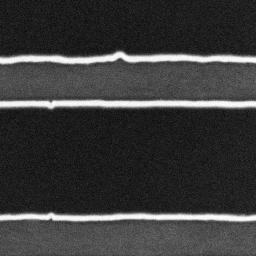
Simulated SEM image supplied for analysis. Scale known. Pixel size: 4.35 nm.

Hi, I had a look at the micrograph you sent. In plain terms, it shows one or a few lines or trenches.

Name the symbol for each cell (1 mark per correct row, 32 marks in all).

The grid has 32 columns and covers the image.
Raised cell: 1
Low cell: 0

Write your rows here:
11111111111111111111111111111111
11111111111111111111111111111111
11111111111111111111111111111111
11111111111111111111111111111111
11111111111111111111111111111111
11111111111111111111111111111111
11111111111111111111111111111111
11100001111110001000000011100111
00000000000000000000000000000000
00000000000000000000000000000000
00000000000000000000000000000000
00000000000000000000000000000000
00000000000000000000000000000000
11111111111111111111111111111111
11111111111111111111111111111111
11111111111111111111111111111111
11111111111111111111111111111111
11111111111111111111111111111111
11111111111111111111111111111111
11111111111111111111111111111111
11111111111111111111111111111111
11111111111111111111111111111111
11111111111111111111111111111111
11111111111111111111111111111111
11111111111111111111111111111111
11111111111111111111111111111111
11111111111111111111111111111111
00000000000000000000000000000000
00000000000000000000000000000000
00000000000000000000000000000000
00000000000000000000000000000000
00000000000000000000000000000000